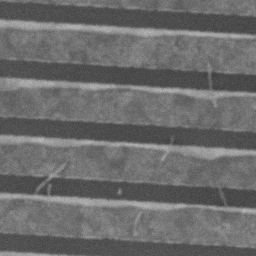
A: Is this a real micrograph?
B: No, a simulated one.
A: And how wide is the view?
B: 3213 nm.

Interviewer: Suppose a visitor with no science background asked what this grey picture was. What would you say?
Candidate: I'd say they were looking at lines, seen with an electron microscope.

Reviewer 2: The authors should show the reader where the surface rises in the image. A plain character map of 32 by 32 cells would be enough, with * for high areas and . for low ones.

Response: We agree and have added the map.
.......*************************
........................********
................................
************....................
******************************..
********************************
********************************
...*****************************
.....................***********
................................
********........................
***********************.........
********************************
********************************
*.******************************
...................*************
................................
*****...........................
**********************..........
********************************
********************************
********************************
..............******************
.............................***
**..............................
*****************...............
********************************
********************************
********************************
........************************
.........................*******
................................